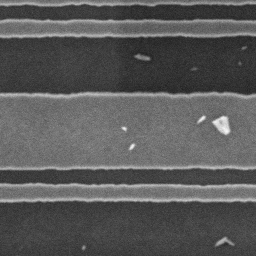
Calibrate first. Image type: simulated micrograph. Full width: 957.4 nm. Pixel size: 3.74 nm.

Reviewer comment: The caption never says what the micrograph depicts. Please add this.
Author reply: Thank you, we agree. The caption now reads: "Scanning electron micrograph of lines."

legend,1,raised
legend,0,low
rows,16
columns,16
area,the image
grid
1111111111111111
1111111111111111
0000000000000000
0000000000000000
0000000000000000
0000000000000000
1111111111111111
1111111111111111
1111111111111111
1111111111111111
1111111111111111
1111111111111111
1111011111111111
0000000000000000
0000000000000000
0000000000000000